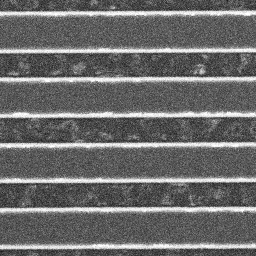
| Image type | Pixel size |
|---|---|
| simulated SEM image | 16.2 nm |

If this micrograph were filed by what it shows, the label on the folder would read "one or a few lines or trenches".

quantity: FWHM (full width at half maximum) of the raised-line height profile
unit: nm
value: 616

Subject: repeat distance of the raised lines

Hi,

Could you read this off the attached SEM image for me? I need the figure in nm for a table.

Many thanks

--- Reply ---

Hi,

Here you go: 1060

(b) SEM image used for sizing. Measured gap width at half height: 456 nm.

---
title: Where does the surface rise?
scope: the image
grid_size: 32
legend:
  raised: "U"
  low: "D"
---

DDDDDDDDDDDDDDDDDDDDDDDDDDDDDDDD
DDDDDDDDDDDDDDDDDDDDDDDDDDDDDDDD
UUUUUUUUUUUUUUUUUUUUUUUUUUUUUUUU
UUUUUUUUUUUUUUUUUUUUUUUUUUUUUUUU
UUUUUUUUUUUUUUUUUUUUUUUUUUUUUUUU
UUUUUUUUUUUUUUUUUUUUUUUUUUUUUUUU
DDDDDDDDDDDDDDDDDDDDDDDDDDDDDDDD
DDDDDDDDDDDDDDDDDDDDDDDDDDDDDDDD
DDDDDDDDDDDDDDDDDDDDDDDDDDDDDDDD
DDDDDDDDDDDDDDDDDDDDDDDDDDDDDDDD
UUUUUUUUUUUUUUUUUUUUUUUUUUUUUUUU
UUUUUUUUUUUUUUUUUUUUUUUUUUUUUUUU
UUUUUUUUUUUUUUUUUUUUUUUUUUUUUUUU
UUUUUUUUUUUUUUUUUUUUUUUUUUUUUUUU
UUUUDDDDDDDDDDDDDDDDDDDDDDDDDDDD
DDDDDDDDDDDDDDDDDDDDDDDDDDDDDDDD
DDDDDDDDDDDDDDDDDDDDDDDDDDDDDDDD
DDDDDDDDDDDDDDDDDDDDDDDDDDDDDDDD
UUUUUUUUUUUUUUUUUUUUUUUUUUUUUUUU
UUUUUUUUUUUUUUUUUUUUUUUUUUUUUUUU
UUUUUUUUUUUUUUUUUUUUUUUUUUUUUUUU
UUUUUUUUUUUUUUUUUUUUUUUUUUUUUUUU
UUUUUUUUUUUUUUUUUUUUUUUUUUUUDDDD
DDDDDDDDDDDDDDDDDDDDDDDDDDDDDDDD
DDDDDDDDDDDDDDDDDDDDDDDDDDDDDDDD
DDDDDDDDDDDDDDDDDDDDDDDDDDDDDDDD
UUUUUUUUUUUUUUUUUUUUUUUUUUUUUUUU
UUUUUUUUUUUUUUUUUUUUUUUUUUUUUUUU
UUUUUUUUUUUUUUUUUUUUUUUUUUUUUUUU
UUUUUUUUUUUUUUUUUUUUUUUUUUUUUUUU
UUUUUUUUUUUUUUUUUUUUUUUUUUUUUUUU
DDDDDDDDDDDDDDDDDDDDDDDDDDDDDDDD